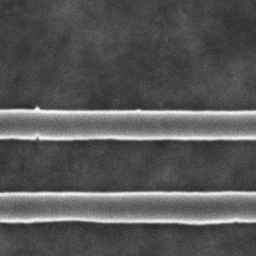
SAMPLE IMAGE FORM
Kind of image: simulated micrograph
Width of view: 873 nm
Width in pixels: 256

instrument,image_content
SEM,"one or a few lines or trenches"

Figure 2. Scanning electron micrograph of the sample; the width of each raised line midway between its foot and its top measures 0.0963 µm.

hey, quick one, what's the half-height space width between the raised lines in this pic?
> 183 nm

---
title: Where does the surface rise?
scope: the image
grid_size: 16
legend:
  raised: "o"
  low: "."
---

................
................
................
................
................
................
................
oooooooooooooooo
oooooooooooooooo
................
................
................
oooooooooooooooo
oooooooooooooooo
................
................